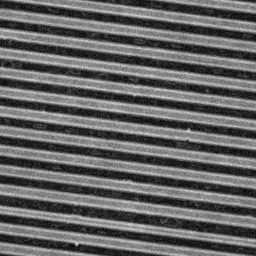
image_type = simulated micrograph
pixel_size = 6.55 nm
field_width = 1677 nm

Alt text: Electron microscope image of parallel lines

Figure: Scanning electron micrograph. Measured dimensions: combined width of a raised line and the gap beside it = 127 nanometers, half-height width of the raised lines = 0.0561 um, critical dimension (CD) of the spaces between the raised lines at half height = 10.9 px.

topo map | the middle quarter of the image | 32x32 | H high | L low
LHHHHHHHHHHHHHHHHHLLLLLLLLLLLLLL
LLLLLLLLHHHHHHHHHHHHHHHHHLLLLLLL
LLLLLLLLLLLLLLLLHHHHHHHHHHHHHHHH
HHHLLLLLLLLLLLLLLLLLLLLLHHHHHHHH
HHHHHHHHHHLLLLLLLLLLLLLLLLLLLLLH
LHHHHHHHHHHHHHHHHHLLLLLLLLLLLLLL
LLLLLLLLLHHHHHHHHHHHHHHHHHLLLLLL
LLLLLLLLLLLLLLLLHHHHHHHHHHHHHHHH
HHHLLLLLLLLLLLLLLLLLLLLLHHHHHHHH
HHHHHHHHHHHLLLLLLLLLLLLLLLLLLLLL
LLLHHHHHHHHHHHHHHHHLLLLLLLLLLLLL
LLLLLLLLLLLHHHHHHHHHHHHHHHLLLLLL
LLLLLLLLLLLLLLLLLLLHHHHHHHHHHHHH
HHHHHLLLLLLLLLLLLLLLLLLLLLHHHHHH
HHHHHHHHHHHHHLLLLLLLLLLLLLLLLLLL
LLLLHHHHHHHHHHHHHHHHHLLLLLLLLLLL
LLLLLLLLLLLLHHHHHHHHHHHHHHHHLLLL
LLLLLLLLLLLLLLLLLLLHHHHHHHHHHHHH
HHHHHHLLLLLLLLLLLLLLLLLLLLLHHHHH
HHHHHHHHHHHHHHLLLLLLLLLLLLLLLLLL
LLLLLLHHHHHHHHHHHHHHHLLLLLLLLLLL
LLLLLLLLLLLLLLHHHHHHHHHHHHHHHLLL
LLLLLLLLLLLLLLLLLLLLLHHHHHHHHHHH
HHHHHHHLLLLLLLLLLLLLLLLLLLLLLHHH
HHHHHHHHHHHHHHLLLLLLLLLLLLLLLLLL
LLLLLLLHHHHHHHHHHHHHHHLLLLLLLLLL
LLLLLLLLLLLLLLHHHHHHHHHHHHHHHLLL
LLLLLLLLLLLLLLLLLLLLLLHHHHHHHHHH
HHHHHHHHHLLLLLLLLLLLLLLLLLLLLHHH
HHHHHHHHHHHHHHHHHLLLLLLLLLLLLLLL
LLLLLLLHHHHHHHHHHHHHHHHLLLLLLLLL
LLLLLLLLLLLLLLLHHHHHHHHHHHHHHHHL